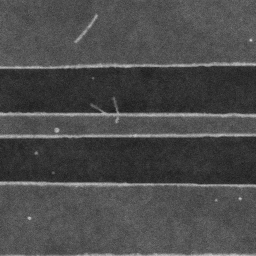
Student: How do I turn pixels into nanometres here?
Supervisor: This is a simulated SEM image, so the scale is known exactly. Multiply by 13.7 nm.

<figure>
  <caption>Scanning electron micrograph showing lines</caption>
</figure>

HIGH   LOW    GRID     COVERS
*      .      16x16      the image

****************
****************
****************
****************
................
................
................
****************
************....
................
................
********........
****************
****************
****************
****************